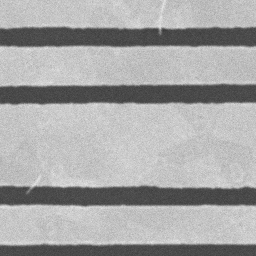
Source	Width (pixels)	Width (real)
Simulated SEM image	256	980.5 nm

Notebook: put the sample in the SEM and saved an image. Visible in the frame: lines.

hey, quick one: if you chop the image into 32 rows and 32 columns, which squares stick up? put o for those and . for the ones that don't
oooooooooooooooooooooooooooooooo
oooooooooooooooooooooooooooooooo
oooooooooooooooooooooooooooooooo
oo.......oo...oooo.ooooo........
................................
................................
oooooooooooooooooooooooooooooooo
oooooooooooooooooooooooooooooooo
oooooooooooooooooooooooooooooooo
oooooooooooooooooooooooooooooooo
ooooooooooooooooooooooooooo..oo.
................................
................................
oooooooooooooooooooooooooooooooo
oooooooooooooooooooooooooooooooo
oooooooooooooooooooooooooooooooo
oooooooooooooooooooooooooooooooo
oooooooooooooooooooooooooooooooo
oooooooooooooooooooooooooooooooo
oooooooooooooooooooooooooooooooo
oooooooooooooooooooooooooooooooo
oooooooooooooooooooooooooooooooo
oooooooooooooooooooooooooooooooo
................................
................................
................................
oooooooooooooooooooooooooooooooo
oooooooooooooooooooooooooooooooo
oooooooooooooooooooooooooooooooo
oooooooooooooooooooooooooooooooo
.ooo.......oo...................
................................